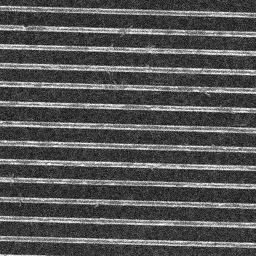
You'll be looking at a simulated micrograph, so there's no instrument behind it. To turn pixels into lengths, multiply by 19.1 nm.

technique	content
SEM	parallel lines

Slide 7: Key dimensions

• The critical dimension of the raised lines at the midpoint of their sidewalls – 83.6 nm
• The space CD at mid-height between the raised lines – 277 nm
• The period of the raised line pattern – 366 nm